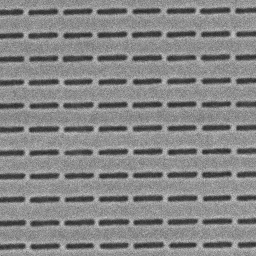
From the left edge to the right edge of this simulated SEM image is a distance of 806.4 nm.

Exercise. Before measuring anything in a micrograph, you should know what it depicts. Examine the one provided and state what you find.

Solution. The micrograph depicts a regular array of holes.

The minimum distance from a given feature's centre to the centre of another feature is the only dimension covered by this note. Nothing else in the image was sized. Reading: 73.3 nm